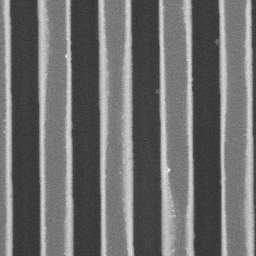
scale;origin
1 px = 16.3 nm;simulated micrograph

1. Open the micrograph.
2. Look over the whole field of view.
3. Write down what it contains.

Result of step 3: lines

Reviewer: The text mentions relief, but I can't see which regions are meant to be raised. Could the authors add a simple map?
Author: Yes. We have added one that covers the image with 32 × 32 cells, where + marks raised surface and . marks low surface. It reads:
+....++++...++++....++++....+++.
+....++++...++++....++++....+++.
+....++++...++++....++++....+++.
+....++++...++++....++++....+++.
+....++++...++++....++++....+++.
+....++++...++++....++++....+++.
+....++++...++++....++++....+++.
+....++++....+++....++++....+++.
+....++++....+++....++++....+++.
+....++++....+++....++++....+++.
+....++++....+++....++++....+++.
+....++++....+++....++++....+++.
+....++++....+++....++++....+++.
+....++++....+++....++++....+++.
+....++++....+++....++++....+++.
+....++++....+++....++++....++++
+....++++....+++....++++....++++
+....++++....+++....++++....++++
+....++++....+++....++++....++++
+....++++....+++....++++....++++
+....++++....+++....++++....++++
+....++++....+++....++++....++++
+....++++....+++....++++....++++
+....++++....+++....++++....++++
+....++++....+++....++++....++++
+....++++....+++....++++....++++
+....++++....+++....++++....++++
+....++++....+++....++++....++++
+....++++....+++....++++....++++
++...++++....++++...++++....++++
++...++++....++++...++++....++++
++...++++....++++...++++....++++